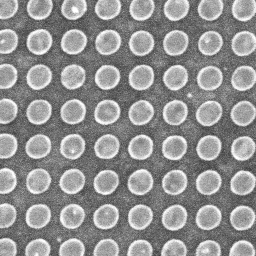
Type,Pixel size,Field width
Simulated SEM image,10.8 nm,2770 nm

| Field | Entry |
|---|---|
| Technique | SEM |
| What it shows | a regular array of raised bodies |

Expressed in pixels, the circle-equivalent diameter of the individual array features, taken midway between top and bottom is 23.8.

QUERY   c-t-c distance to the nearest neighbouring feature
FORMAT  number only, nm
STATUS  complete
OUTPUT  367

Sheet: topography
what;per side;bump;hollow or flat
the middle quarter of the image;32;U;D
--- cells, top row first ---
DDDDDDDDDDDUDDDDDDDUUDDDDDDDDDDD
DDDDDDDDDUUUUDDDDUUUUUDDDDUUUUUD
DDDDDDDDUUUUUUDDDUUUUUDDDUUUUUUD
DDDDDDDDUUUUUUDDUUUUUUDDDUUUUUUD
DDDDDDDDUUUUUDDDDUUUUUDDDUUUUUUD
DDDDDDDDDUUUUDDDDUUUUDDDDDUUUUDD
DDDDDDDDDDDDDDDDDDDDDDDDDDDDDDDD
DDDDDDDDDDDDDDDDDDDDDDDDDDDDDDDD
DDDDDDDDDDDDDDDDDDDDDDDDDDDDDDDD
DUUUDDDDDDUUUDDDDDUUUDDDDDDUUDDD
UUUUUDDDUUUUUUDDDUUUUUDDDDUUUUDD
UUUUUDDDUUUUUUDDDUUUUUDDDUUUUUUD
UUUUUDDDUUUUUUDDUUUUUUDDDUUUUUDD
UUUUUDDDUUUUUDDDDUUUUUDDDUUUUUDD
DUUDDDDDDUUUDDDDDUUUUDDDDDUUUDDD
DDDDDDDDDDDDDDDDDDDDDDDDDDDDDDDD
DDDDDDDDDDDDDDDDDDDDDDDDDDDDDDDD
DDDDDDDDDDDDDDDDDDDDDDDDDDDDDDDD
DUUUDDDDDUUUUDDDDDUUUDDDDDUUUDDD
UUUUUDDDUUUUUUDDDUUUUUDDDUUUUUDD
UUUUUDDDUUUUUUDDUUUUUUDDDUUUUUUD
UUUUUDDDUUUUUDDDUUUUUUDDDUUUUUDD
UUUUDDDDUUUUUDDDDUUUUUDDDUUUUUDD
DDDDDDDDDUUUDDDDDDUUDDDDDDUUDDDD
DDDDDDDDDDDDDDDDDDDDDDDDDDDDDDDD
DDDDDDDDDDDDDDDDDDDDDDDDDDDDDDDD
DDDDDDDDDDDDDDDDDDDDDDDDDDDDDDDD
UUUUUDDDDUUUUDDDDUUUUDDDDDUUUUDD
UUUUUDDDUUUUUDDDUUUUUUDDDUUUUUUD
UUUUUDDDUUUUUDDDUUUUUUDDDUUUUUUD
UUUUUDDDUUUUUDDDUUUUUUDDDUUUUUDD
UUUUDDDDUUUUDDDDDUUUUDDDDUUUUUDD